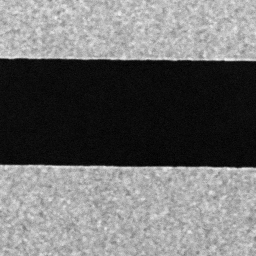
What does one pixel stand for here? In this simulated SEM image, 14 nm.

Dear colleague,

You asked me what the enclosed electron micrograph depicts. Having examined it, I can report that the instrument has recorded wiring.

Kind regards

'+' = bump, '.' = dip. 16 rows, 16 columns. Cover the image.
++++++++++++++++
++++++++++++++++
++++++++++++++++
++++++++++++++++
................
................
................
................
................
................
+++++++++++++...
++++++++++++++++
++++++++++++++++
++++++++++++++++
++++++++++++++++
++++++++++++++++